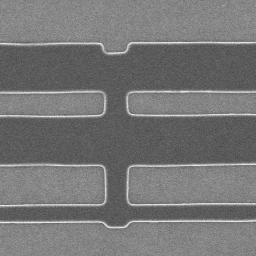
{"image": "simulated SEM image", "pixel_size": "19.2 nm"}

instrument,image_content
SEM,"groups of lines, slits or small figures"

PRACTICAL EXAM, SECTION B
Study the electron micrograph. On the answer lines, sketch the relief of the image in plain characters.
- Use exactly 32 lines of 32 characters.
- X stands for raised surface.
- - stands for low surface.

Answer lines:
--------------------------------
--------------------------------
--------------------------------
--------------------------------
--------------------------------
X-----XXXXXXX---XXXXXXXXXXXXXXXX
XXXXXXXXXXXXX--XXXXXXXXXXXXXXXXX
XXXXXXXXXXXXXXXXXXXXXXXXXXXXXXXX
XXXXXXXXXXXXXXXXXXXXXXXXXXXXXXXX
XXXXXXXXXXXXXXXXXXXXXXXXXXXXXXXX
XXXXXXXXXXXXXXXXXXXXXXXXXXXXXXXX
XXXXXXXXX---XXXXX---------------
-------------XXX----------------
-------------XXX----------------
------------XXXXXXXXXXXXXXXXXXXX
XXXXXXXXXXXXXXXXXXXXXXXXXXXXXXXX
XXXXXXXXXXXXXXXXXXXXXXXXXXXXXXXX
XXXXXXXXXXXXXXXXXXXXXXXXXXXXXXXX
XXXXXXXXXXXXXXXXXXXXXXXXXXXXXXXX
XXXXXXXXXXXXXXXXXXXXXXXXXXXXXXXX
XXXXXXXXXXXXXXXXXXXXXXXXXXXXXXXX
-------------XXX----------------
-------------XXX----------------
-------------XXX----------------
-------------XXX----------------
-------------XXX----------------
XXXXXXXXXXXXXXXXXXXXXXXXXXXXXXXX
XXXXXXXXXXXXXXXXXXXXXXXXXXXXXXXX
--------------------------------
--------------------------------
--------------------------------
--------------------------------